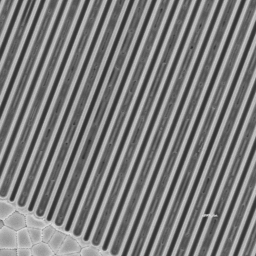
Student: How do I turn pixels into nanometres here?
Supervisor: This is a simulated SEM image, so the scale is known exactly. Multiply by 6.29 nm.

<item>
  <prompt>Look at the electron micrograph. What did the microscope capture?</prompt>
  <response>parallel lines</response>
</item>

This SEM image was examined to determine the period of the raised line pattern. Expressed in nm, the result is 65.4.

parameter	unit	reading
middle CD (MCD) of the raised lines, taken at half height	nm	28.6